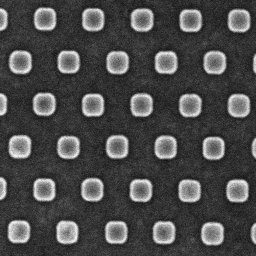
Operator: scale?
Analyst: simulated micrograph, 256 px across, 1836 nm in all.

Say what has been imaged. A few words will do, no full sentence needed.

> a regular array of raised bodies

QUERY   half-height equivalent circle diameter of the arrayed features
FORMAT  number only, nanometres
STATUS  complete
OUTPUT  160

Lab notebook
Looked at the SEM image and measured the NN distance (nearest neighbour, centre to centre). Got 347 nm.